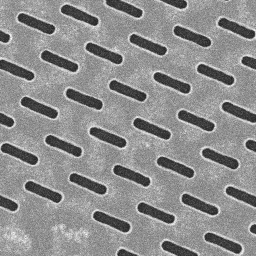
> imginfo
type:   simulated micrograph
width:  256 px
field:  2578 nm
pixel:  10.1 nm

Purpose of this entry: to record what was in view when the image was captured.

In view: a regular array of holes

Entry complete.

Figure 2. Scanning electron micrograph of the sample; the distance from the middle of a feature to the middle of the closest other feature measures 44.5 px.